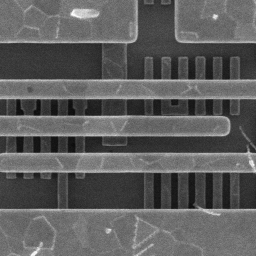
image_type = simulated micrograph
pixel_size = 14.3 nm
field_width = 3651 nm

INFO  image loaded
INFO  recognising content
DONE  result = wiring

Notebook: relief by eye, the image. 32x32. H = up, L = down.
HHHHHHHHHHHHHHHHHLLLLLHHHHHHHHHH
HHHHHHHHHHHHHHHHHLLLLLHHHHHHHHHH
HHHHHHHHHHHHHHHHHLLLLLHHHHHHHHHH
HHHHHHHHHHHHHHHHHLLLLLHHHHHHHHHH
HHHHHHHHHHHHHHHHHLLLLLHHHHHHHHHH
LLLLLLLLLLLLLLLLLLLLLLLLLLLLLLLL
LLLLLLLLLLLLLLLLLLLLLLLLLLLLLLLL
LLLLLLLLLLLLLLLLLLLLLLLLLLLLLLLL
LLLLLLLLLLLLLLLLLLLLLLLLLLLLLLLL
LLLLLLLLLLLLLLLLLLLLLLLLLLLLLLLL
HHHHHHHHHHHHHHHHHHHHHHHHHHHHHHHH
HHHHHHHHHHHHHHHHHHHHHHHHHHHHHHHH
LLLLLLLLLLLLLLLLLLLLLLLLLLLLLLLL
LLLLLLLLLLLLLLLLLLLLLLLLLLLLLLLL
HHHHHHHHHHHLHHHHHHHHHLHHHHHHLLLL
HHHHHHHHHHHHHHHHHHHHHHHHHHHHHLLL
HHHHHHHHHHHHHHHHHHHHHHHHHHHHHLLL
LLLLLLLLLLLLLLLLLLLLLLLLLLLLLLLL
LLLLLLLLLLLLLLLLLLLLLLLLLLLLLLLL
HHHHHHHHHHHHHHHHHHHHHHHHHHHHHHHH
HHHHHHHHHHHHHHHHHHHHHHHHHHHHHHHH
LHHHHHHHHHHHHHHHHHHHHHHHHHHHHHHH
LLLLLLLLLLLLLLLLLLLLLLLLLLLLLLLL
LLLLLLLLLLLLLLLLLLLLLLLLLLLLLLLL
LLLLLLLLLLLLLLLLLLLLLLLLLLLLLLLL
LLLLLLLLLLLLLLLLLLLLLLLLLLLLLLLL
HHHHHHHHHHHHHHHHHHHHHHHHHHHHHHHH
HHHHHHHHHHHHHHHHHHHHHHHHHHHHHHHH
HHHHHHHHHHHHHHHHHHHHHHHHHHHHHHHH
HHHHHHHHHHHHHHHHHHHHHHHHHHHHHHHH
HHHHHHHHHHHHHHHHHHHHHHHHHHHHHHHH
HHHHHHHHHHHHHHHHHHHHHHHHHHHHHHHH